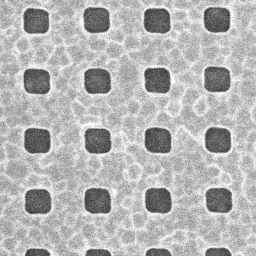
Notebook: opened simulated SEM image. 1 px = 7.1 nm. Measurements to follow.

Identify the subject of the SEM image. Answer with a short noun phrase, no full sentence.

a regular array of holes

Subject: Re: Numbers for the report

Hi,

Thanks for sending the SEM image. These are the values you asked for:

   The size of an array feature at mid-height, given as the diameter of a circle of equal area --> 207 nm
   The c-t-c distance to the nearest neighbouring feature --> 425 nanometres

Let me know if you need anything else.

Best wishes